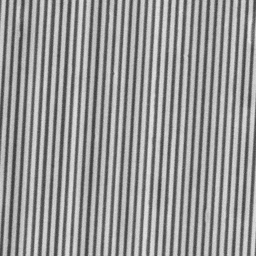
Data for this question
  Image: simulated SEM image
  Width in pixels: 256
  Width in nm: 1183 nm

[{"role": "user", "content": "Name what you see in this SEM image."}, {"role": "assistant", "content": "parallel lines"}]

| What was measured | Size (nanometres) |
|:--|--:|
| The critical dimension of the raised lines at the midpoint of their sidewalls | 17.9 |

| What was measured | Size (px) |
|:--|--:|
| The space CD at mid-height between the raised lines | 3.87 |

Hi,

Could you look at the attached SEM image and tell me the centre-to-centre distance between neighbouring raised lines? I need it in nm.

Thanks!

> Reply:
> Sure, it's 35.7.